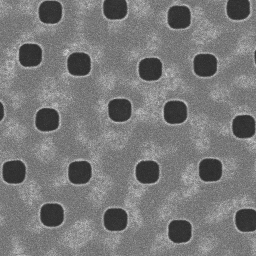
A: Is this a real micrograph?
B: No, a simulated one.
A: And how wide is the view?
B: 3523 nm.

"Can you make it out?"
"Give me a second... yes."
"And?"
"a regular array of holes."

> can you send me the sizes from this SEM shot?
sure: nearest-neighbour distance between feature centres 52.9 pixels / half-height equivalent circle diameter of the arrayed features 343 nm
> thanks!